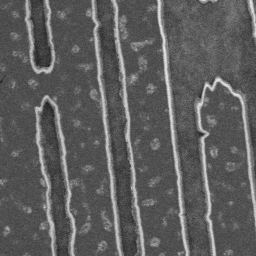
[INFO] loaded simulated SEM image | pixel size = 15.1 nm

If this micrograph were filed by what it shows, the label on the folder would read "one or a few lines or trenches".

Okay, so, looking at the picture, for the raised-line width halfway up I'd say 666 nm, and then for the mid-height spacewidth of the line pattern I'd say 346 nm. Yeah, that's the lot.